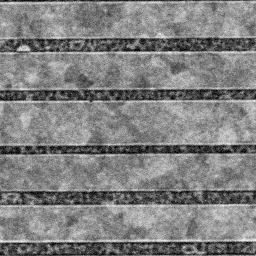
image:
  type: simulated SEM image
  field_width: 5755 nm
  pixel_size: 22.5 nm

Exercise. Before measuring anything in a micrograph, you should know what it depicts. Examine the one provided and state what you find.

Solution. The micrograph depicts parallel lines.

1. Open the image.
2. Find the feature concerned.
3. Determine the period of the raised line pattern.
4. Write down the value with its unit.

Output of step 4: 1140 nanometres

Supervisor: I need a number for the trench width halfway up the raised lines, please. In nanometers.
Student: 332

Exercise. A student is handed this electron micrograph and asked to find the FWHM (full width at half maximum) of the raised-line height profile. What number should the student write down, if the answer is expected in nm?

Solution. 820